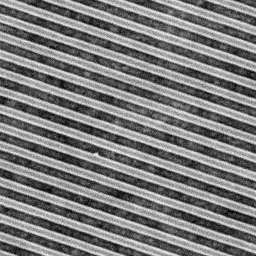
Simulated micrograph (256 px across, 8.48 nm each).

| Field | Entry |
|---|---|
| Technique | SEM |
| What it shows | parallel lines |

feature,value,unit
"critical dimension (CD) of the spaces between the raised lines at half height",0.0803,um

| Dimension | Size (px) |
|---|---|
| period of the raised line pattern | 17.3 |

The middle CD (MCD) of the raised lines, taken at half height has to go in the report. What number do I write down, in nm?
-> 65.3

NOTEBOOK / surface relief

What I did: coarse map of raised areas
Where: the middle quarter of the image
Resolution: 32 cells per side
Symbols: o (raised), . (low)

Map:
...oooooo........oooooo.......oo
......oooooo........oooooo......
oo.......oooooo........oooooo...
ooooo.......oooooo........oooooo
..oooooo.......oooooo........ooo
.....oooooo.......oooooo........
........oooooo.......oooooo.....
ooo........oooooo.......oooooo..
oooooo........oooooo.......ooooo
...oooooo........oooooo.......oo
......oooooo........oooooo......
o........oooooo........oooooo...
oooo........oooooo........oooooo
.oooooo........oooooo........ooo
.....ooooo........oooooo........
.......oooooo........oooooo.....
ooo.......oooooo........oooooo..
oooooo.......oooooo........ooooo
...oooooo........ooooo........oo
......oooooo........ooooo.......
o.......oooooo........oooooo....
oooo........ooooo.........ooooo.
.ooooooo......oooooo.........ooo
....oooooo........ooooo........o
.......oooooo........ooooo......
ooo.......oooooo........ooooo...
ooooo........oooooo.......oooooo
..oooooo........oooooo.......ooo
.....oooooo........oooooo.......
o.......oooooo........oooooo....
oooo.......oooooo........oooooo.
.oooooo.......oooooo........oooo